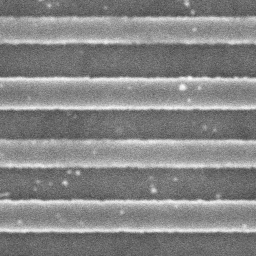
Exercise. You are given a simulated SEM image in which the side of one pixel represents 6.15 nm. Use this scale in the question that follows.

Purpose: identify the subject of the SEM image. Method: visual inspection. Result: lines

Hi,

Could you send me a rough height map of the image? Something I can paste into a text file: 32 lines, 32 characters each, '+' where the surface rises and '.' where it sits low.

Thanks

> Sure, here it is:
................................
................................
++++++++++++++++++++++++++++++++
++++++++++++++++++++++++++++++++
++++++++++++++++++++++++++++++++
................................
................................
................................
................................
................................
++++++++++++++++++++++++++++++++
++++++++++++++++++++++++++++++++
++++++++++++++++++++++++++++++++
++++++++++++++++++++++++++++++++
................................
................................
................................
................................
++++++++++++++++++++++++++++++++
++++++++++++++++++++++++++++++++
++++++++++++++++++++++++++++++++
................................
................................
................................
................................
++++++++++++++++++++++++++++++++
++++++++++++++++++++++++++++++++
++++++++++++++++++++++++++++++++
++++++++++++++++++++++++++++++++
................................
................................
................................